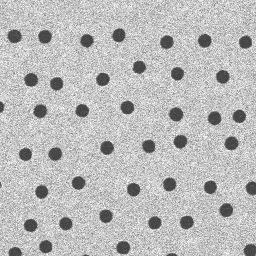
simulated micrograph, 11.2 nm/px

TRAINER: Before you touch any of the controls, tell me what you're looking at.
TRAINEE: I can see a regular array of holes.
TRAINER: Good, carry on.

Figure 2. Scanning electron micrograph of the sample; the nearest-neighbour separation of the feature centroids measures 361 nanometres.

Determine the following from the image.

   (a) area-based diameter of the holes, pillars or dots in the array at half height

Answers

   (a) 0.15 microns